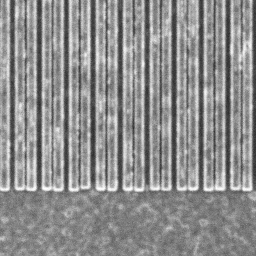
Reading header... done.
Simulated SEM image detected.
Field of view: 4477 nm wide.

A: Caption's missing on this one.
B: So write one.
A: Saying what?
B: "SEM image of parallel lines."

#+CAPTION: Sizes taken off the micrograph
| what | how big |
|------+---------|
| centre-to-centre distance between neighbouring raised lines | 0.233 um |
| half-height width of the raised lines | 0.16 microns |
